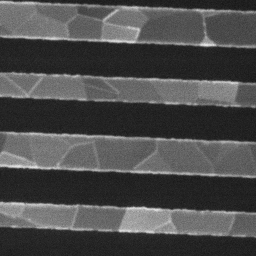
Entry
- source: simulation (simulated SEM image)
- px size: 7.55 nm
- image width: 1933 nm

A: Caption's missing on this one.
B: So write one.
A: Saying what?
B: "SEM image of lines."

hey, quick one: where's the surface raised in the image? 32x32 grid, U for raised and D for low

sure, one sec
UUUUUUUDDDDDDDDDDDDDDDDDDDDDDDDD
UUUUUUUUUUUUUUUUUUUUUUUUUUUUUUUU
UUUUUUUUUUUUUUUUUUUUUUUUUUUUUUUU
UUUUUUUUUUUUUUUUUUUUUUUUUUUUUUUU
UUUUUUUUUUUUUUUUUUUUUUUUUUUUUUUU
DDDDDDDDDDDDDDDDDDDDDDUUUUUUUUUU
DDDDDDDDDDDDDDDDDDDDDDDDDDDDDDDD
DDDDDDDDDDDDDDDDDDDDDDDDDDDDDDDD
DDDDDDDDDDDDDDDDDDDDDDDDDDDDDDDD
UUUUUUUUUDDDDDDDDDDDDDDDDDDDDDDD
UUUUUUUUUUUUUUUUUUUUUUUUUUUUUUUU
UUUUUUUUUUUUUUUUUUUUUUUUUUUUUUUU
DDDDDDDDDDDUUUUUUUUUUUUUUUUUUUUU
DDDDDDDDDDDDDDDDDDDDDDDDDDDDDDDD
DDDDDDDDDDDDDDDDDDDDDDDDDDDDDDDD
DDDDDDDDDDDDDDDDDDDDDDDDDDDDDDDD
DDDDDDDDDDDDDDDDDDDDDDDDDDDDDDDD
UUUUUUUUUUUUUUUUUUUUUUUUDDDDDDDD
UUUUUUUUUUUUUUUUUUUUUUUUUUUUUUUU
UUUUUUUUUUUUUUUUUUUUUUUUUUUUUUUU
UUUUUUUUUUUUUUUUUUUUUUUUUUUUUUUU
DDDDDDDDDDDDDDDDDUUUUUUUUUUUUUUU
DDDDDDDDDDDDDDDDDDDDDDDDDDDDDDDD
DDDDDDDDDDDDDDDDDDDDDDDDDDDDDDDD
DDDDDDDDDDDDDDDDDDDDDDDDDDDDDDDD
UUUDDDDDDDDDDDDDDDDDDDDDDDDDDDDD
UUUUUUUUUUUUUUUUUUUUUUUUUUUUDDDD
UUUUUUUUUUUUUUUUUUUUUUUUUUUUUUUU
DDDDDDDUUUUUUUUUUUUUUUUUUUUUUUUU
DDDDDDDDDDDDDDDDDDDDDDDDDDDDDDDD
DDDDDDDDDDDDDDDDDDDDDDDDDDDDDDDD
DDDDDDDDDDDDDDDDDDDDDDDDDDDDDDDD